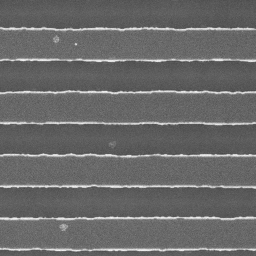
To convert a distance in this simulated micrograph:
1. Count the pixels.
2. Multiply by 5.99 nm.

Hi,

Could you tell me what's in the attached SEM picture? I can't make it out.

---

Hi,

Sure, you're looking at lines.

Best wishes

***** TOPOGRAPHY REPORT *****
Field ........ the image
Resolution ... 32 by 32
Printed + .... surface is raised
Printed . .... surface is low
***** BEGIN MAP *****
................................
................................
................................
................................
++++++++++++++++++++++++++++++++
++++++++++++++++++++++++++++++++
++++++++++++++++++++++++++++++++
..........++++.....++.........++
................................
................................
................................
........+..........+++..........
++++++++++++++++++++++++++++++++
++++++++++++++++++++++++++++++++
++++++++++++++++++++++++++++++++
....................+.....++++..
................................
................................
................................
+++++++++++++++...+++++.++++++++
++++++++++++++++++++++++++++++++
++++++++++++++++++++++++++++++++
++++++++++++++++++++++++++++++++
................................
................................
................................
................................
++++++++++++++++++++++++++++++++
++++++++++++++++++++++++++++++++
++++++++++++++++++++++++++++++++
++++++++++++++++++++++++++++++++
................................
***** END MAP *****